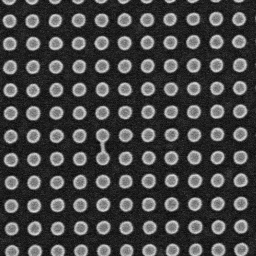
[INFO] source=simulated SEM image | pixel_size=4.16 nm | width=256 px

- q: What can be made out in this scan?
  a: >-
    a regular array of raised bodies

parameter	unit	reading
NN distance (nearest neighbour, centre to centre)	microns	0.0946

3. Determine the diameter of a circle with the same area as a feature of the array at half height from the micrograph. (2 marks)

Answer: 52.5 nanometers